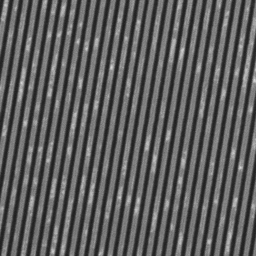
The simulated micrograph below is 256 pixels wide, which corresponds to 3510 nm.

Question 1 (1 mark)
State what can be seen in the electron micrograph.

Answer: parallel lines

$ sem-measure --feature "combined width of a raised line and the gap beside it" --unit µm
0.131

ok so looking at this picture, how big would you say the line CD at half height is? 64.3 nm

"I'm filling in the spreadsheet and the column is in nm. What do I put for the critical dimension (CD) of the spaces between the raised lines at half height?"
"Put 76.1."